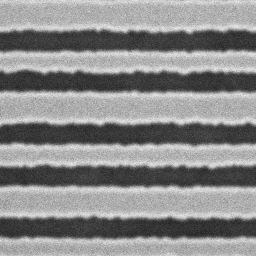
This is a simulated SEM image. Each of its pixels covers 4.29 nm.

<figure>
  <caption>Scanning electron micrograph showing lines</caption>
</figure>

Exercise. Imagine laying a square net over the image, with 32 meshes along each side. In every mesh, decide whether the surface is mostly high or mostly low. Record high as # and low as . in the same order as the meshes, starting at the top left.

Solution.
################################
################################
################################
################################
................................
................................
.##.....#.#.########.##.###.###.
################################
################################
................................
................................
................................
################################
################################
################################
.......#....#...#...........##..
................................
................................
################################
################################
################################
................................
................................
###############.##.####.######..
################################
################################
################################
................................
................................
................................
################################
################################